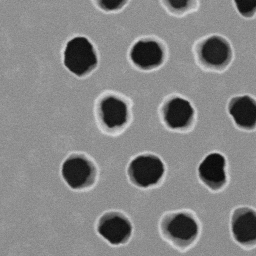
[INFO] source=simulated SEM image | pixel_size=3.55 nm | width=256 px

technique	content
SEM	a regular array of holes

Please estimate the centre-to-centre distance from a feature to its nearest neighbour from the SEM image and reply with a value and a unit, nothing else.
233 nm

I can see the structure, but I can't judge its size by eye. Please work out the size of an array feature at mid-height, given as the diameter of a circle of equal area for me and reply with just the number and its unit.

114 nm